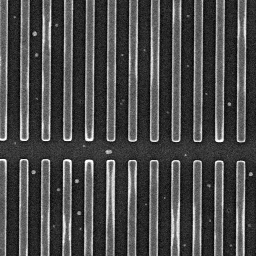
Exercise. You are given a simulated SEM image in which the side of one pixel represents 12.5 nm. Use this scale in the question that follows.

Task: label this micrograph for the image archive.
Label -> groups of lines, slits or small figures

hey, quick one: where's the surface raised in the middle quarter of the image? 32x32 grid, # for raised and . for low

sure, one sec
##...##....##...##....##...##...
##...##....##...##....##...##...
##...##....##...##....##...##...
##...##....##...##....##...##...
##...##....##...##....##...##...
##...##....##...##....##...##...
##...##....##...##....##...##...
##...##....##...##....##...##...
##...##....##...##....##...##...
##...##....##...##....##...##...
##...##....##...##....##...##...
##...##....##...##....##...##...
##...##....##...##....##...##...
##...##....##...##....##...##...
##...##....##...##....##...##...
##...##....##...##....##...##...
##...##....##...##....##...##...
##...##....##...##....##...##...
##...##....##...##....##...##...
................................
................................
................................
................................
................................
##....#....##...##....#....##...
##...##....##...##....##...##...
##...##....#....##....##...##...
##...##....#....##....#....##...
##...##....#....##....##...##...
##...##....#....##....##...##...
##...##....#....##....##...##...
##...##....#....##....##...##...